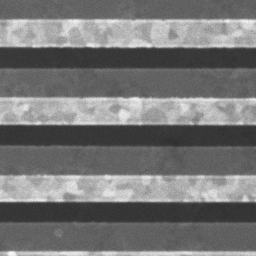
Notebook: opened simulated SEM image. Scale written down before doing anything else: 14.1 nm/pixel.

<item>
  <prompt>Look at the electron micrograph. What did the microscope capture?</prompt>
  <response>lines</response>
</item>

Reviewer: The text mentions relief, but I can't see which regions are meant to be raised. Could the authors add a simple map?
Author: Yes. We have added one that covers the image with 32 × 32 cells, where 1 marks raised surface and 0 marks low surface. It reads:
11111111111111111111111111111111
11111111111111111111111111111111
11111111111111111111111111111111
11111111111111111111111111111111
11111111111111111111111111111111
11111111111111111111111111111111
00000000000000000000000000000000
00000000000000000000000000000000
00000000000000000000000000000000
11111111111111111111111111111111
11111111111111111111111111111111
11111111111111111111111111111111
11111111111111111111111111111111
11111111111111111111111111111111
11111111111111111111111111111111
11111111111111111111111111111111
00000000000000000000000000000000
00000000000000000000000000000000
11111111111111111111111111111111
11111111111111111111111111111111
11111111111111111111111111111111
11111111111111111111111111111111
11111111111111111111111111111111
11111111111111111111111111111111
11111111111111111111111111111111
00000000000000000000000000000000
00000000000000000000000000000000
00000000000000000000000000000000
11111111111111111111111111111111
11111111111111111111111111111111
11111111111111111111111111111111
11111111111111111111111111111111